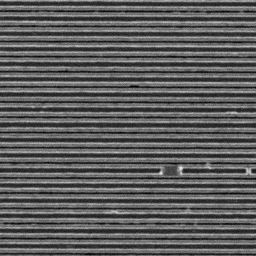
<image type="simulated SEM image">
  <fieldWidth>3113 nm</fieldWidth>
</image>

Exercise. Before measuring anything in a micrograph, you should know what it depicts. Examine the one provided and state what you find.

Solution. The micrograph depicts parallel lines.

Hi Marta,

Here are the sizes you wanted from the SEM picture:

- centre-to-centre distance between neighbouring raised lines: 92.2 nm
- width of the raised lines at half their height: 41.1 nm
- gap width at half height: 0.0623 micrometres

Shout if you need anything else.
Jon